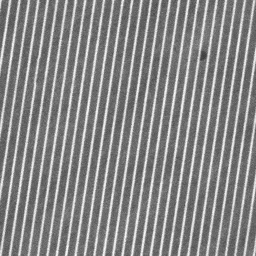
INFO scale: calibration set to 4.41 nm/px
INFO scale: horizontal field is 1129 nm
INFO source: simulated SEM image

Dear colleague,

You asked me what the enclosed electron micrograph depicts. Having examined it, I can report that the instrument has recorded parallel lines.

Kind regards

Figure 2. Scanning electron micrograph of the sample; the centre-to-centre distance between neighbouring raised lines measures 41 nm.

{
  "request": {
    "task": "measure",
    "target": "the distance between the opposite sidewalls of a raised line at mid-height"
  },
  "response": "6 nm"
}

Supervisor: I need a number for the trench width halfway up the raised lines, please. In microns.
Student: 0.0349